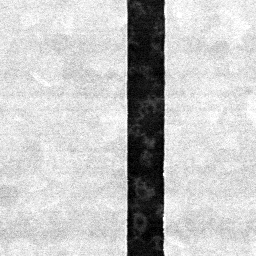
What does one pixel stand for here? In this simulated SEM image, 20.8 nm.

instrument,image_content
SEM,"one or a few lines or trenches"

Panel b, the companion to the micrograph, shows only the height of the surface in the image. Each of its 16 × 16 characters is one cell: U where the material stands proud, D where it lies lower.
UUUUUUUUDDUUUUUU
UUUUUUUUDDUUUUUU
UUUUUUUUDDUUUUUU
UUUUUUUUDDUUUUUU
UUUUUUUUDDUUUUUU
UUUUUUUUDDUUUUUU
UUUUUUUUDDUUUUUU
UUUUUUUUDDUUUUUU
UUUUUUUUDDUUUUUU
UUUUUUUUDDUUUUUU
UUUUUUUUDDUUUUUU
UUUUUUUUDDUUUUUU
UUUUUUUUDDUUUUUU
UUUUUUUUDDUUUUUU
UUUUUUUUDDUUUUUU
UUUUUUUUDDUUUUUU